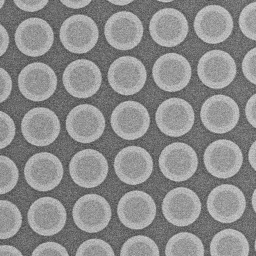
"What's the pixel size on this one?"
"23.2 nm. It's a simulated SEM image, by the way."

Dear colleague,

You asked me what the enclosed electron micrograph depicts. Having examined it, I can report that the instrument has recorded an array of small figures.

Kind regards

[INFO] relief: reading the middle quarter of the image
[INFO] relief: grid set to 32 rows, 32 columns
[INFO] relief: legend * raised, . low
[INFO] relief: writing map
.*******....********..*********.
*********..*********..**********
*********..*********..**********
*********..*********..*********.
*********..*********...********.
*********...********....******..
.*******.....******......****...
..*****.......***...............
................................
...............***.......******.
...****......*******....********
..*******....*******...*********
.********...*********..*********
.*********..*********..*********
.*********..*********..*********
.*********..*********..*********
.*********..*********...*******.
.********....*******.....*****..
..*******......***..............
....***.........................
..........................*****.
.....**.......******.....*******
...******.....*******...********
..********...*********..********
..*********..*********..********
.**********..*********..********
.**********..*********..********
..*********..*********...*******
..********....*******.....*****.
...******......*****............
....****........................
...........................*****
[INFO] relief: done